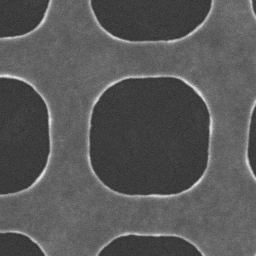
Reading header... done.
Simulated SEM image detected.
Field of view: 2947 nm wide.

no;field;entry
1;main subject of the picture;holes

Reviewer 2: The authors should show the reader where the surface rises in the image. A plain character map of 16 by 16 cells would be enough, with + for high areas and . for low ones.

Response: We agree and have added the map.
...+++.......+++
..++++.......+++
++++++++...+++++
++++++++++++++++
++++++++++++++++
..+++++.....++++
...+++.......+++
...+++.......+++
...+++.......+++
...+++.......++.
...+++.......+++
..+++++.....++++
++++++++++++++++
++++++++++++++++
++++++++++++++++
...++++.....++++